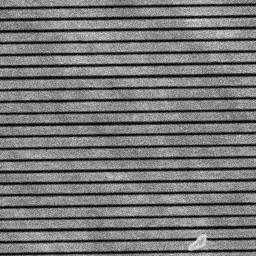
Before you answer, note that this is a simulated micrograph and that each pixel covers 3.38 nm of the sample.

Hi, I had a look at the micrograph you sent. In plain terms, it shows parallel lines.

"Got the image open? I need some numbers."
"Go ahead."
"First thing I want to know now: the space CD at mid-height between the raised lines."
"8.9 nm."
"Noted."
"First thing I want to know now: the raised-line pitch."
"11.7 pixels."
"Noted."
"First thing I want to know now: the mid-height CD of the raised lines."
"31.3 nanometers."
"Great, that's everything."